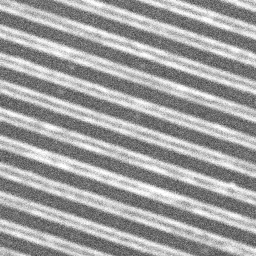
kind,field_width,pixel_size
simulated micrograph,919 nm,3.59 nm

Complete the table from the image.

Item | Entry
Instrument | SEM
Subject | parallel lines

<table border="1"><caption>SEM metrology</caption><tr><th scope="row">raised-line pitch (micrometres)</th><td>0.0946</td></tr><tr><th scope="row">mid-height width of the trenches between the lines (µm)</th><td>0.0545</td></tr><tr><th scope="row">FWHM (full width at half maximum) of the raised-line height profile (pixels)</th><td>10.4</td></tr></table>